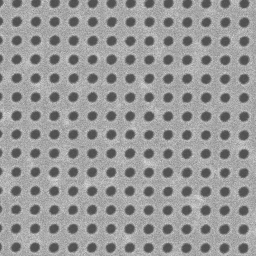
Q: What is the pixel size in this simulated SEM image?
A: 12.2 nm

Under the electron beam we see a regular array of holes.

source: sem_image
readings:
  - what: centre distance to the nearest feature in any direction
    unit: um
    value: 0.227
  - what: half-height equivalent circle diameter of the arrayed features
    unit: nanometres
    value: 122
